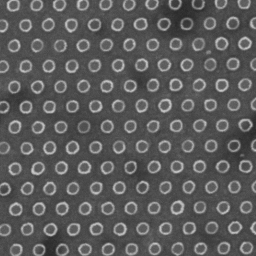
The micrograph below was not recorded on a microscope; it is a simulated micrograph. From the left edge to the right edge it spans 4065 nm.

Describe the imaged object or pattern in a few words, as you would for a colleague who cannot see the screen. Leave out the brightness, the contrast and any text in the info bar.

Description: a regular array of raised bodies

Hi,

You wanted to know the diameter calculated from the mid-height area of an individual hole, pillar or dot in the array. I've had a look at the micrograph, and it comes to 195 nm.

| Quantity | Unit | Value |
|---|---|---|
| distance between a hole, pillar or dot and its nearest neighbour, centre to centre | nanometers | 359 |